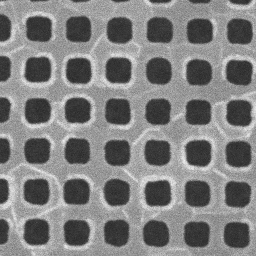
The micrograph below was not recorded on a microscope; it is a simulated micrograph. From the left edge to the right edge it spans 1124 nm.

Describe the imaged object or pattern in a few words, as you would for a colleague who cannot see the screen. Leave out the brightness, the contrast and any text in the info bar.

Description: a regular array of holes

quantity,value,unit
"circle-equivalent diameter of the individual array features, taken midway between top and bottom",0.122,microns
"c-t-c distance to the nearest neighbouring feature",175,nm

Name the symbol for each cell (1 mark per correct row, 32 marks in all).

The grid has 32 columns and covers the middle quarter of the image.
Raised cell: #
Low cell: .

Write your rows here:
#......###.......###.......###..
.......###.......###.......###..
.......###.......###.......###..
#......####......####......###..
#.....#####.....#####.....#####.
################################
################################
################################
##...###################.#######
......#####.....#####......####.
.......###......####.......###..
.......###.......###.......###..
.......###.......###.......###..
.......###.......###.......###..
#.....#####.....#####.....#####.
#######################..#######
################################
################################
################################
#.....#####.....#####.....#####.
......####.......###.......###..
.......###.......###.......###..
.......###.......###.......###..
.......###......####.......###..
#.....#####.....#####.....#####.
############...#################
################################
################################
################################
......#####....######.....#####.
.......###......####.......###..
......####.......###.......###..